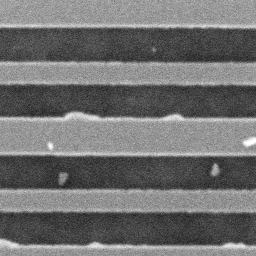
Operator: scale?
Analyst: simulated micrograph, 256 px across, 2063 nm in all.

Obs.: lines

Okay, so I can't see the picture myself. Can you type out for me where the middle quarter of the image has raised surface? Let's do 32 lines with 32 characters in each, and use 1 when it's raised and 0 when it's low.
11111111111111111111111111111111
11111111111111111111111111111111
11111111111111111111111111111111
11111111111111111111111111111111
11111111111111111111111111111111
00000000000000000000000000000000
00000000000000000000000000000000
00000000000000000000000000000000
00000000000000000000000000000000
00000000000000000000000000000000
00000000000000000000000000000000
00000000000000000000000000000000
01111000000000000000000000000000
01111100000000000000000000011000
11111111111111111111111111111111
11111111111111111111111111111111
11111111111111111111111111111111
11111111111111111111111111111111
11111111111111111111111111111111
11111111111111111111111111111111
11111111111111111111111111111111
11111111111111111111111111111111
11111111111111111111111111111111
00000000000000000000000000000000
00000000000000000000000000000000
00000000000000000000000000000000
00000000000000000000000000000000
10000000000000000000000000000000
10000000000000000000000000000000
00000000000000000000000000000000
00000000000000000000000000000000
00000000000000000000000000000000